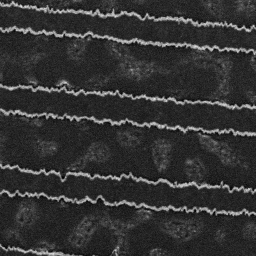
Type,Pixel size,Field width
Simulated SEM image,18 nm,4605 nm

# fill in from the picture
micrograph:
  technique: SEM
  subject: one or a few lines or trenches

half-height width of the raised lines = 454 nm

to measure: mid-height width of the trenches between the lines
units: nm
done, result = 1010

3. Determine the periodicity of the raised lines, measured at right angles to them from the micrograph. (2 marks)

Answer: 1460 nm